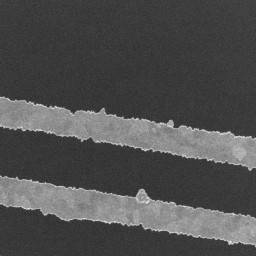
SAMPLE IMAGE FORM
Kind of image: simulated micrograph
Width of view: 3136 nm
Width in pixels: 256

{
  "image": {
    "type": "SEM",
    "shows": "one or a few lines or trenches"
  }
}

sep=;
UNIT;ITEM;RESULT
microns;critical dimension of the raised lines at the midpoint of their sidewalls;0.341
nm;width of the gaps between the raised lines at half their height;611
